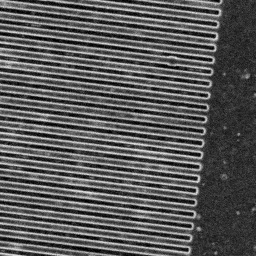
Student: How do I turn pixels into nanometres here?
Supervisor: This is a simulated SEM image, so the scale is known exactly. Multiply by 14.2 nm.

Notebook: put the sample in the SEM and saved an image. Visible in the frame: parallel lines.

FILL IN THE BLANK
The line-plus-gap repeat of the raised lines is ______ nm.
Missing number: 170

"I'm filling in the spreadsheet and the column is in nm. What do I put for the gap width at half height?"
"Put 73.9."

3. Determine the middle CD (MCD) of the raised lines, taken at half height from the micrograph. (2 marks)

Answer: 0.0985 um